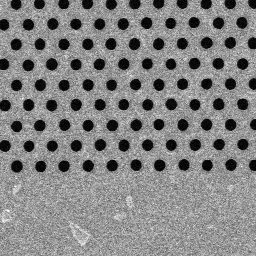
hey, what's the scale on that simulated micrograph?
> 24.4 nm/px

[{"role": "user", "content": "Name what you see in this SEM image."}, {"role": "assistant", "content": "a regular array of holes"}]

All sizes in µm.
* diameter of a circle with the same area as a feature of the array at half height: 0.282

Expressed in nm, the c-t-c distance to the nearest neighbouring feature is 561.